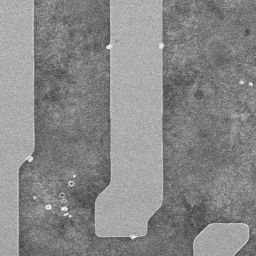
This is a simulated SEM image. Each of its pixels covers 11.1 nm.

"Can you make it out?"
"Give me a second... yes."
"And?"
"groups of lines, slits or small figures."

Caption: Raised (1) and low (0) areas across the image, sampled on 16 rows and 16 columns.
1100000111000000
1100000111000000
1100000111000000
1100000111000000
1100000111000000
1100000111000000
1100000111000000
1100000111000000
1100000111000000
1100000111000000
1000000111000000
1000000111000000
1000001111000000
1000001111000000
1000001110000111
1000000000001110